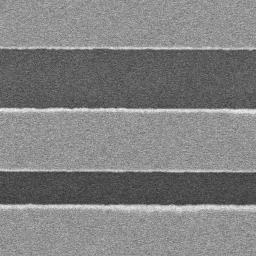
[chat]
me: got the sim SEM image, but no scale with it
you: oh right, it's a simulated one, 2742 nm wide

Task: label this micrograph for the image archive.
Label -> lines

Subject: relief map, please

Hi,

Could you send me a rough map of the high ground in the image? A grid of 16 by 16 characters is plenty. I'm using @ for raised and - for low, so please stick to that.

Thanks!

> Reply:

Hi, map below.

@@@@@@@@@@@@@@@@
@@@@@@@@@@@@@@@@
@@@@@@@@@@@@@@@@
----------------
----------------
----------------
----------------
@@@@@@@@@@@@@@@@
@@@@@@@@@@@@@@@@
@@@@@@@@@@@@@@@@
@@@@@@@@@@@@@@@@
----------------
----------------
@@@@@@@@@@@@@@@@
@@@@@@@@@@@@@@@@
@@@@@@@@@@@@@@@@